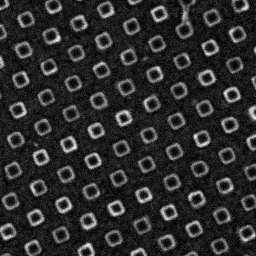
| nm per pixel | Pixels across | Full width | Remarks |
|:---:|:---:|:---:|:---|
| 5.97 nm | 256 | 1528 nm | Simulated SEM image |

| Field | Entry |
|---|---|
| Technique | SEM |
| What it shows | a regular array of raised bodies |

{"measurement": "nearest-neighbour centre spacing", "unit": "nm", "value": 178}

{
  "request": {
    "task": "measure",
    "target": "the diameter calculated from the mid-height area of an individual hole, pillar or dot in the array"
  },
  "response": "89.1 nm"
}